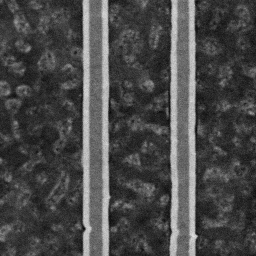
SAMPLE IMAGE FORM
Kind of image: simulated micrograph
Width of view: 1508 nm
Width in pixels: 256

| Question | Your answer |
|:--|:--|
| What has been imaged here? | one or a few lines or trenches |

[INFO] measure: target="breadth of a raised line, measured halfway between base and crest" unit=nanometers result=119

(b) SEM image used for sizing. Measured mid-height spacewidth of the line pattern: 398 nanometers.